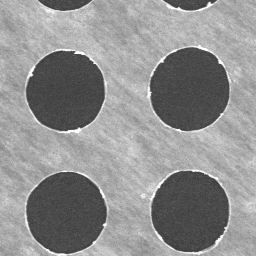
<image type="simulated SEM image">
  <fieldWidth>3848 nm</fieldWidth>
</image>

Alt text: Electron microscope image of holes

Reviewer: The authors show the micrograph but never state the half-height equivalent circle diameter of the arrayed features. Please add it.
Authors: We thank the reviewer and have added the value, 1210 nm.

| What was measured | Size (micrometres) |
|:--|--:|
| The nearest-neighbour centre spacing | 1.83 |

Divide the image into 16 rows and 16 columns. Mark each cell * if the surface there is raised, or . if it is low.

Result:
***..******..***
****************
****************
***..******..***
**....****....**
**.....**.....**
**....***.....**
**....****...***
****************
****************
****************
**....****....**
**.....***....**
**.....**.....**
**....****....**
***..******..***